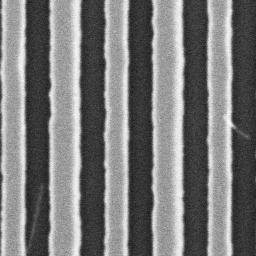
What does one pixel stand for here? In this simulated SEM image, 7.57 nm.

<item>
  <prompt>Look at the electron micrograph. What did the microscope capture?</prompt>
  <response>lines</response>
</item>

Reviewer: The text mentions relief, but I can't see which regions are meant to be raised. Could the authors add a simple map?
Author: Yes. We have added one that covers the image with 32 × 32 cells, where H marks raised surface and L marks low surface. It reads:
HHHLLLHHHHLLLHHHLLLHHHHLLLHHHLLL
HHHLLLHHHHLLLHHHLLLHHHHLLLHHHLLL
HHHLLLHHHHLLLHHHLLLHHHHLLLHHHLLL
HHHLLLHHHHLLLHHHLLLHHHHLLLHHHLLL
HHHLLLHHHHLLLHHHLLLHHHHLLLHHHLLL
HHHLLLHHHHLLLHHHLLLHHHHLLLHHHLLL
HHHLLLHHHHLLLHHHLLLHHHHLLLHHHLLL
HHHLLLHHHHLLLHHHLLLHHHHLLLHHHLLL
HHHLLLHHHHLLLHHHLLLHHHHLLLHHHLLL
HHHLLLHHHHLLLHHHLLLHHHHLLLHHHLLL
HHHLLLHHHHLLLHHHLLLHHHHLLLHHHLLL
HHHLLLHHHHLLLHHHLLLHHHHLLLHHHLLL
HHHLLLHHHHLLLHHHLLLHHHHLLLHHHLLL
HHHLLLHHHHLLLHHHLLLHHHHLLLHHHLLL
HHHLLLHHHHLLLHHHLLLHHHHLLLHHHLLL
HHHLLLHHHHLLLHHHLLLHHHHLLLHHHLLL
HHHLLLHHHHLLLHHHLLLHHHHLLLHHHLLL
HHHLLLHHHHLLLHHHLLLHHHHLLLHHHLLL
HHHLLLHHHHLLLHHHLLLHHHHLLLHHHLLL
HHHLLLHHHHLLLHHHLLLHHHHLLLHHHLLL
HHHLLLHHHHLLLHHHLLLHHHHLLLHHHLLL
HHHLLLHHHHLLLHHHLLLHHHHLLLHHHLLL
HHHLLLHHHHLLLHHHLLLHHHHLLLHHHLLL
HHHLLLHHHHLLLHHHLLLHHHHLLLHHHLLL
HHHLLLHHHHLLLHHHLLLHHHHLLLHHHLLL
HHHLLLHHHHLLLHHHLLLHHHHLLLHHHLLL
HHHLLLHHHHLLLHHHLLLHHHHLLLHHHLLL
HHHLLLHHHHLLLHHHLLLHHHHLLLHHHLLL
HHHLLLHHHHLLLHHHLLLHHHHLLLHHHLLL
HHHLLLHHHHLLLHHHLLLHHHHLLLHHHLLL
HHHLLLHHHHLLLHHHLLLHHHHLLLHHHLLL
HHHLLLHHHHLLLHHHLLLHHHHLLLHHHLLL